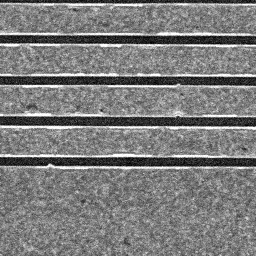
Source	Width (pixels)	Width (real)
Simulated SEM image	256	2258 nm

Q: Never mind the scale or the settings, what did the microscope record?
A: parallel lines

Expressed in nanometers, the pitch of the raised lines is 363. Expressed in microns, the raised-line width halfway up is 0.271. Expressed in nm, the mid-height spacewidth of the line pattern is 82.7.